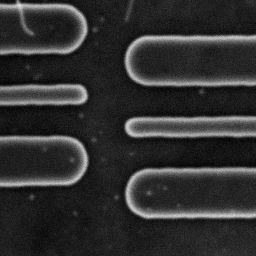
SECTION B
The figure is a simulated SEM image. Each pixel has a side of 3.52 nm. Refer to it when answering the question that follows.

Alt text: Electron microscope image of groups of lines, slits or small figures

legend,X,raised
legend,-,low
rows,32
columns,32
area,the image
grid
--------------------------------
XXXXXXXXXX----------------------
XXXXXXXXXXX---------------------
XXXXXXXXXXX---------------------
XXXXXXXXXXX---------------------
XXXXXXXXXX-------XXXXXXXXXXXXXXX
XXXXXXXXX-------XXXXXXXXXXXXXXXX
----------------XXXXXXXXXXXXXXXX
----------------XXXXXXXXXXXXXXXX
----------------XXXXXXXXXXXXXXXX
-------------------XXXXXXXXX---X
XXXXXXXXXXX---------------------
XXXXXXXXXXX---------------------
--------------------------------
--------------------------------
----------------XXXXXXXXXXXXXXXX
----------------XXXXXXXXXXXXXXXX
XXXXXXXXX-----------------------
XXXXXXXXXX----------------------
XXXXXXXXXXX---------------------
XXXXXXXXXXX---------------------
XXXXXXXXXX-------XXXXXXXXXXXXXXX
XXXXXXXXXX------XXXXXXXXXXXXXXXX
----------------XXXXXXXXXXXXXXXX
----------------XXXXXXXXXXXXXXXX
----------------XXXXXXXXXXXXXXXX
-----------------XXXXXXXXXXXXXXX
--------------------------------
--------------------------------
--------------------------------
--------------------------------
--------------------------------